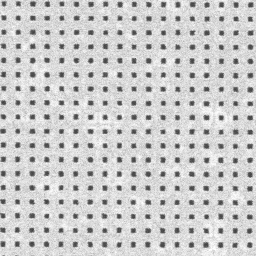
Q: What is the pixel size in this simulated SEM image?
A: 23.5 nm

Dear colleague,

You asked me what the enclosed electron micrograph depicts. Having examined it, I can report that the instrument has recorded a regular array of holes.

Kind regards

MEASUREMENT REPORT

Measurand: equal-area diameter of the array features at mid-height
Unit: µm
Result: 0.15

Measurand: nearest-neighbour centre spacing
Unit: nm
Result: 327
